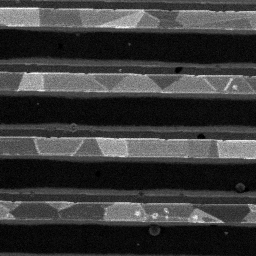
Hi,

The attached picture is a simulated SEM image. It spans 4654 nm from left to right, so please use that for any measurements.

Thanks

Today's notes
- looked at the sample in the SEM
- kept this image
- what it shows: lines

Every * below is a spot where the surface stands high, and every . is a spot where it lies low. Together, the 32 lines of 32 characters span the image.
********************************
********************************
********************************
.................***************
................................
................................
................................
................................
********************************
********************************
********************************
..........**********************
................................
................................
................................
................................
********************************
********************************
********************************
.........***********************
................................
................................
................................
................................
****************************....
********************************
********************************
.......*************************
................................
................................
................................
................................